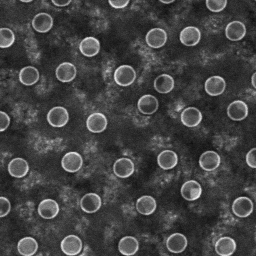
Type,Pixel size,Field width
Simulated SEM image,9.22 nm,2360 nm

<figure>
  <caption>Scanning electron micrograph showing a regular array of raised bodies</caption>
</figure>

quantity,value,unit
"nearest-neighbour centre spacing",362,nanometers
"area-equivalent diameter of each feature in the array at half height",180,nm